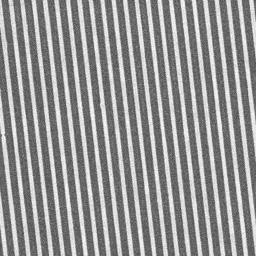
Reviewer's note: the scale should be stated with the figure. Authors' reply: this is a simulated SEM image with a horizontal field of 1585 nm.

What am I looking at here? parallel lines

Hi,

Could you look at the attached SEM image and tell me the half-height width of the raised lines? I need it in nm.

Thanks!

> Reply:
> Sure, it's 20.7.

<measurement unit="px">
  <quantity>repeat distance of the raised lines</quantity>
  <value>11.4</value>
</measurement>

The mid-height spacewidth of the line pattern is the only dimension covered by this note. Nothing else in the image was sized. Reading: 0.0515 micrometres